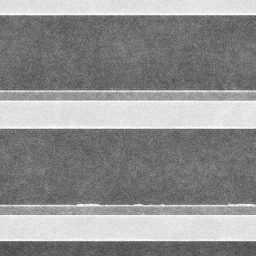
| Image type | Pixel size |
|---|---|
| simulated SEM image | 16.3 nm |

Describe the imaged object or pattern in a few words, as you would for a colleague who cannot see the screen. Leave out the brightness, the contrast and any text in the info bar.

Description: lines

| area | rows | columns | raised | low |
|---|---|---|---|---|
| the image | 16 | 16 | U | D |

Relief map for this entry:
UUUUUUUUUUUUUUUU
DDDDDDDDDDDDDDDD
DDDDDDDDDDDDDDDD
DDDDDDDDDDDDDDDD
DDDDDDDDDDDDDDDD
DDDDDDDDDDDDDDDD
UUUUUUUUUUUUUUUU
UUUUUUUUUUUUUUUU
DDDDDDDDDDDDDDDD
DDDDDDDDDDDDDDDD
DDDDDDDDDDDDDDDD
DDDDDDDDDDDDDDDD
DDDDDDDDDDDDDDDD
UUUUUUUUUUUUUUUU
UUUUUUUUUUUUUUUU
DDDDDDDDDDDDDDDD